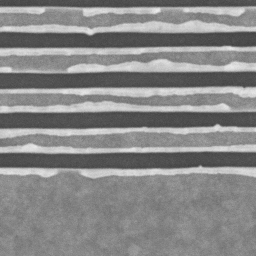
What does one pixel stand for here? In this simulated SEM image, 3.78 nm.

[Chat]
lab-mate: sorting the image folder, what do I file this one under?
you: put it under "parallel lines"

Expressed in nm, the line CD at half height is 90.7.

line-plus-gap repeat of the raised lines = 0.151 µm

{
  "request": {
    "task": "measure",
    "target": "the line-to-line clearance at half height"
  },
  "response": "0.0614 µm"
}